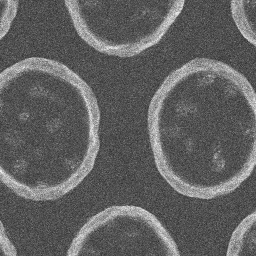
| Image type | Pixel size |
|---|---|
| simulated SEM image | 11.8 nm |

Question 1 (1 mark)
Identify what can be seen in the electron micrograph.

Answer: raised bodies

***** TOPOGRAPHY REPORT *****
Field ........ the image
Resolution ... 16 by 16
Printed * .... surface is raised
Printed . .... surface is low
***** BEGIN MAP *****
*....******....*
.....*****.....*
......****......
................
.***.......***..
*****.....*****.
******....******
******....******
******....******
******....******
*****.....******
.***.......****.
................
.......**.......
.....*****.....*
*....******....*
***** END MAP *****